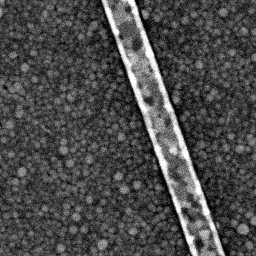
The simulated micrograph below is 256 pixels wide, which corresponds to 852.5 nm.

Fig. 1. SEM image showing one or a few lines or trenches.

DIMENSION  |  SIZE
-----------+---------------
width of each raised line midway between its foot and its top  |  27.1 pixels